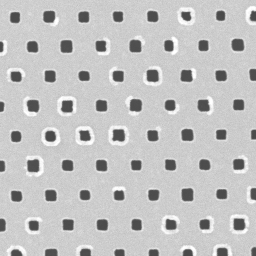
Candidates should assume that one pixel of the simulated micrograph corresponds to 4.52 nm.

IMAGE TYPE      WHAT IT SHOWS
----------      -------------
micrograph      a regular array of holes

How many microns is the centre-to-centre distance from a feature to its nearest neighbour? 0.153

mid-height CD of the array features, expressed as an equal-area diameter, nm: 55.1